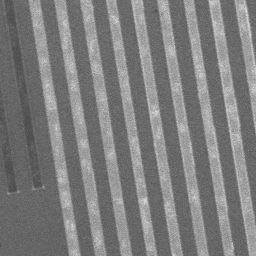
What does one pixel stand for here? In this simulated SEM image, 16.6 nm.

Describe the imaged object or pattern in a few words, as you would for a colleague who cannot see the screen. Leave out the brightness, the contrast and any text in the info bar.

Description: parallel lines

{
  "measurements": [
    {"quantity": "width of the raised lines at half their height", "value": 166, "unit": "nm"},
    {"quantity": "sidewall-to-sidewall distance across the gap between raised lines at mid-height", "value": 259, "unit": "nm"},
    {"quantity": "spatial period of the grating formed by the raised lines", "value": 0.423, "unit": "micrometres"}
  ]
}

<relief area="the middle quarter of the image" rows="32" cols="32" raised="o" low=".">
ooo....oo....oo.....oo....oo....
.oo....oo....ooo....oo....ooo...
.oo....ooo....oo....oo.....oo...
.oo....ooo....oo....oo.....oo...
.oo....ooo....oo....ooo....oo...
.ooo....oo....oo....ooo....oo...
.ooo....oo....oo....ooo....oo...
..oo....oo....ooo....oo....ooo..
..oo....ooo....oo....oo....ooo..
..oo....ooo....oo....oo....ooo..
..oo....ooo....oo....ooo....oo..
..ooo....oo....oo....ooo....oo..
..ooo....oo....oo....ooo....oo..
..ooo....oo....ooo....oo....oo..
...oo....oo.....oo....oo....ooo.
...oo....ooo....oo....oo.....oo.
...oo....ooo....oo....ooo....oo.
...ooo....oo....oo....ooo....oo.
...ooo....oo....oo....ooo....oo.
...ooo....oo....ooo....oo....oo.
....oo....oo.....oo....oo....ooo
....oo....ooo....oo....oo.....oo
....oo....ooo....oo....oo.....oo
....oo.....oo....oo....ooo....oo
....ooo....oo....oo.....oo....oo
....ooo....oo....oo.....oo....oo
.....oo....oo....ooo....oo....oo
o....oo....ooo....oo....oo.....o
o....oo....ooo....oo....oo.....o
o....oo....ooo....oo....ooo....o
o....ooo....oo....oo.....oo....o
o....ooo....oo....oo.....oo....o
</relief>